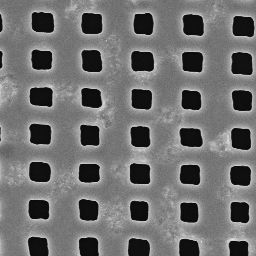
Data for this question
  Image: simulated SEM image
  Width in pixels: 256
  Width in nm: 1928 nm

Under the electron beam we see a regular array of holes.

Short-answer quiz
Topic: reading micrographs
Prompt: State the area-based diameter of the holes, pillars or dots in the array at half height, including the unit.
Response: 165 nanometers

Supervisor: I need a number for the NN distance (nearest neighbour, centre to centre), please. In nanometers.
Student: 280